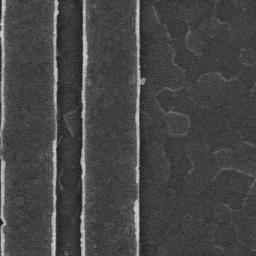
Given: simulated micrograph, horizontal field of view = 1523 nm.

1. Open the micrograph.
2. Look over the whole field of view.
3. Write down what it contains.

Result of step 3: one or a few lines or trenches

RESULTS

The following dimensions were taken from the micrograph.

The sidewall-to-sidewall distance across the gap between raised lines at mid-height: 155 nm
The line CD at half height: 0.332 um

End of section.